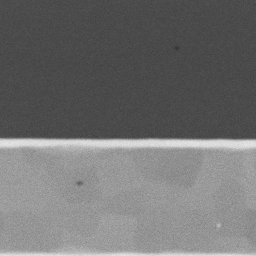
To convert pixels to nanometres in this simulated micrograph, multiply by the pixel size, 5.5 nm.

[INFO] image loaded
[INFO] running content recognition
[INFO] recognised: wiring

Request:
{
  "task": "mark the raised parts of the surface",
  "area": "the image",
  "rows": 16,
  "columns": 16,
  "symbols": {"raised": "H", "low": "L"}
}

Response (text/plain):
LLLLLLLLLLLLLLLL
LLLLLLLLLLLLLLLL
LLLLLLLLLLLLLLLL
LLLLLLLLLLLLLLLL
LLLLLLLLLLLLLLLL
LLLLLLLLLLLLLLLL
LLLLLLLLLLLLLLLL
LLLLLLLLLLLLLLLL
LLLLLLLLLLLLLLLL
HHHHHHHHHHHHHHHH
HHHHHHHHHHHHHHHH
HHHHHHHHHHHHHHHH
HHHHHHHHHHHHHHHH
HHHHHHHHHHHHHHHH
HHHHHHHHHHHHHHHH
HHHHHHHHHHHHHHHH